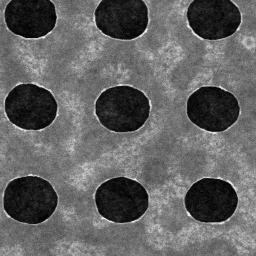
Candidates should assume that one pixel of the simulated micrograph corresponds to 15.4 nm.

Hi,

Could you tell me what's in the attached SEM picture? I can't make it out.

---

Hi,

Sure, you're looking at holes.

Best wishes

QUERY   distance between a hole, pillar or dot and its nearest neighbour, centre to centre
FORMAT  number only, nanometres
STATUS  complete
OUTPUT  1390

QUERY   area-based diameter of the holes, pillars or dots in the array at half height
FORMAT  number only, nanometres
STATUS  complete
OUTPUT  765